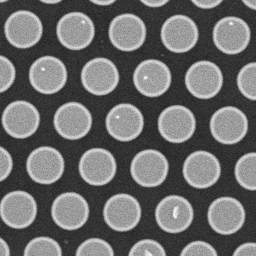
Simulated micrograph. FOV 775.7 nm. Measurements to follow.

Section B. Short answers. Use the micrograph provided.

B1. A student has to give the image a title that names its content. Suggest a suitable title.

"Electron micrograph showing an array of small figures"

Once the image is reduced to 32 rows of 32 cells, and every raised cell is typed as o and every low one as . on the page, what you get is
............oo....ooo...ooo....o
..oo............................
.oooo..oooo...oooo...ooo....oo..
.oooo..ooooo..oooo..ooooo..oooo.
.oooo..ooooo..oooo..ooooo..oooo.
.ooo....ooo...oooo..oooo...oooo.
......................o.....oo..
o....oo....ooo....oo............
oo..oooo..ooooo..oooo...ooo...oo
oo..oooo..ooooo..oooo..ooooo..oo
o...oooo..ooooo..oooo..ooooo..oo
.....oo....ooo...oooo...ooo...oo
................................
.ooo...oooo...ooo....oo.....oo..
ooooo..oooo..ooooo..oooo...oooo.
ooooo..oooo..ooooo..oooo..ooooo.
.ooo...oooo...oooo..oooo..ooooo.
...............o.....oo....ooo..
.....oo.........................
o...oooo..oooo...ooo....ooo...oo
oo.ooooo..oooo..ooooo..oooo...oo
o..ooooo..oooo..ooooo..ooooo.ooo
....ooo....ooo...oooo..oooo...oo
.........................o.....o
.ooo...ooo....oo.....o..........
ooooo..oooo..oooo...oooo..oooo..
ooooo.ooooo..ooooo.ooooo..ooooo.
oooo...oooo..oooo...oooo..ooooo.
..o.....oo....ooo...ooo....ooo..
................................
o...ooo...oooo...ooo....oo....oo
o..ooooo..oooo..ooooo..oooo..ooo